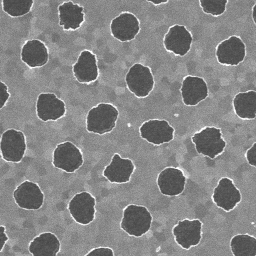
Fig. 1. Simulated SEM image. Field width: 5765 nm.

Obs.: a regular array of holes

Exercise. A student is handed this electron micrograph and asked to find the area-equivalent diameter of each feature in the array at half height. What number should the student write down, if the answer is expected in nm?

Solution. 634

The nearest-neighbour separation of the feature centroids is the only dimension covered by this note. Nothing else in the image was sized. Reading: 1190 nm